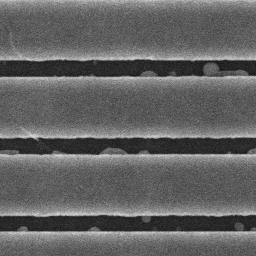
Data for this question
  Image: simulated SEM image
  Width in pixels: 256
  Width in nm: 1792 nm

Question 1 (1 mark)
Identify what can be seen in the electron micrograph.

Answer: lines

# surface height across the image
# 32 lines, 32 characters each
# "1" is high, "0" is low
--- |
11111111111111111111111111111111
11111111111111111111111111111111
11111111111111111111111111111111
11111111111111111111111111111111
11111111111111111111111111111111
11111111111111111111111111111111
11111111111111111111111111111111
00011100001000000000000010000000
00000000000000000000000000000000
00000000000000000000000000000000
11111111111111111111111111111111
11111111111111111111111111111111
11111111111111111111111111111111
11111111111111111111111111111111
11111111111111111111111111111111
11111111111111111111111111111111
11111111111111111111111111111111
00000000000000000000000000000000
00000000000000000000000000000000
11111111111111111111111111111111
11111111111111111111111111111111
11111111111111111111111111111111
11111111111111111111111111111111
11111111111111111111111111111111
11111111111111111111111111111111
11111111111111111111111111111111
11111111111111111111111111111111
00000000000000000000000000000000
00000000000000000000000000000000
11111111111111111111111111111111
11111111111111111111111111111111
11111111111111111111111111111111